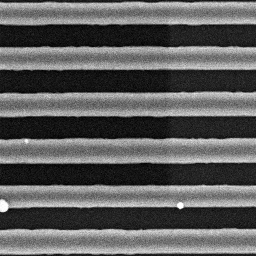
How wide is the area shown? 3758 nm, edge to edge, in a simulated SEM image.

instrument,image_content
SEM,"lines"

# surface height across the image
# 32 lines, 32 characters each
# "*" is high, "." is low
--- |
********************************
********************************
********************************
................................
................................
................................
********************************
********************************
********************************
................................
................................
................................
********************************
********************************
***................*............
................................
................................
********************************
********************************
********************************
................................
................................
................................
********************************
********************************
********************************
................................
................................
................................
********************************
********************************
********************************